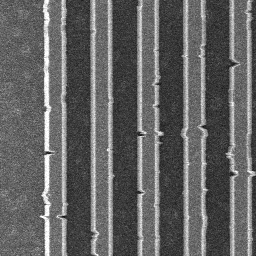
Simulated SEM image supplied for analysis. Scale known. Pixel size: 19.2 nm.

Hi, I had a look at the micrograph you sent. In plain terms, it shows parallel lines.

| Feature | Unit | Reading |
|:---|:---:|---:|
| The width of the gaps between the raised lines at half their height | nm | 532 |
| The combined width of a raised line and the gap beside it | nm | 888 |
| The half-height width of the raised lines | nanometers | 343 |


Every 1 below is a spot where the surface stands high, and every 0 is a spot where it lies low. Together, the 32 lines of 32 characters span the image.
00000011000011000111000110000110
00000011000011000111000110000110
00000011000011000111000110000110
00000011000011000111000110000110
00000011000011000111000110000110
00000011000011000111000110000110
00000011000011000111000110000110
00000011000011000111000110000110
00000011000011000111000110000110
00000011000011000111000110000110
00000011000011000111000110000110
00000011000011000111000110000110
00000011000011000111000110000110
00000011000011000111000110000110
00000011000011000111000110000110
00000011000011000111000110000110
00000011000011000011000111000110
00000011000011000111000111000110
00000011000011000111000110000110
00000011000011000111000110000110
00000011000011000011000111000110
00000011000011000011000110000111
00000011000011000011000110000110
00000011000011000011000111000110
00000011000011000011000111000110
00000011000011000111000110000110
00000011000011000011000111000110
00000011000011000011000111000110
00000011000011000011000111000110
00000011000011000011000110000110
00000011000011000011000110000110
00000011000011000011000110000110